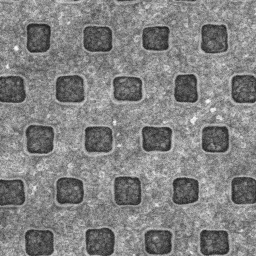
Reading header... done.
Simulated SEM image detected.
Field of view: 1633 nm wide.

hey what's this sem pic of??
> a regular array of holes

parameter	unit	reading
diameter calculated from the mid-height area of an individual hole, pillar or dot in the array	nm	192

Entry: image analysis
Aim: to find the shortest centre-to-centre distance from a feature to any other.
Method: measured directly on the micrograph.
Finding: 366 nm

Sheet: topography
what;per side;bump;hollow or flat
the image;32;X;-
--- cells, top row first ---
XXXXXXXXXXXXXXXXXXXXXXXXXXXXXXXX
XXXXXXXXXXXXXXXXXXXXXXXXXXXXXXXX
XXXXXXXXXXXXXXXXXXXXXXXXXXXXXXXX
XXX---XXXXX---XXXX---XXXX---XXXX
XXX---XXXX----XXXX---XXXX---XXXX
XXX---XXXXX---XXXX---XXXX---XXXX
XXXX-XXXXXXX-XXXXXXXXXXXXX--XXXX
XXXXXXXXXXXXXXXXXXXXXXXXXXXXXXXX
XXXXXXXXXXXXXXXXXXXXXXXXXXXXXXXX
--XXXXXX--XXXXX-XXXXXX--XXXXX---
---XXXX----XXX----XXXX---XXXX---
---XXXX----XXX----XXXX---XXXX---
---XXXX----XXX----XXXX---XXXX---
XXXXXXXXXXXXXXXXXXXXXXXXXXXXXXXX
XXXXXXXXXXXXXXXXXXXXXXXXXXXXXXXX
XXXXXXXXXXXXXXXXXXXXXXXXXXXXXXXX
XXX----XXXX---XXXX----XXX----XXX
XXX----XXX----XXXX----XXX----XXX
XXX----XXX----XXXX---XXXX----XXX
XXXXXXXXXXXXXXXXXXXXXXXXXXXXXXXX
XXXXXXXXXXXXXXXXXXXXXXXXXXXXXXXX
XXXXXXXXXXXXXXXXXXXXXXXXXXXXXXXX
XXXXXXX---XXXX---XXXXX--XXXXX---
---XXXX----XXX----XXXX---XXXX---
---XXXX---XXXX----XXXX---XXXX---
---XXXX--XXXXXX--XXXXX-XXXXXXX-X
XXXXXXXXXXXXXXXXXXXXXXXXXXXXXXXX
XXXXXXXXXXXXXXXXXXXXXXXXXXXXXXXX
XXXXXXXXXXXXXXXXXXXXXXXXXXXXXXXX
XXX----XXXX---XXXX----XXX----XXX
XXX----XXXX---XXXX----XXX----XXX
XXX----XXXX---XXXX---XXXX---XXXX